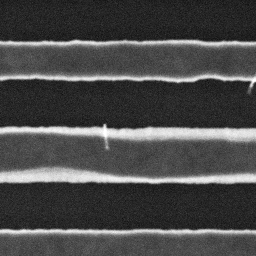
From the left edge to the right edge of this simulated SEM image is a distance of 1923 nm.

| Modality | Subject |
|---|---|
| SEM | lines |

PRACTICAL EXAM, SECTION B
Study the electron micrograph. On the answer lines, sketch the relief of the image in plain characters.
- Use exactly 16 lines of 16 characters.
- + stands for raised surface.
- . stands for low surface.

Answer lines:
................
................
................
++++++++++++++++
++++++++++++++++
................
................
................
++++++++++++++++
++++++++++++++++
++++++++++++++++
................
................
................
++++++++++++++++
++++++++++++++++